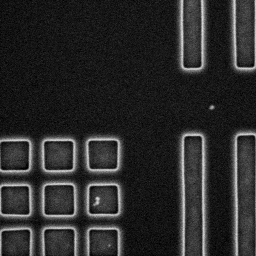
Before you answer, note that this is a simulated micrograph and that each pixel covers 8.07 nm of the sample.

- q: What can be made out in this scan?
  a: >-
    groups of lines, slits or small figures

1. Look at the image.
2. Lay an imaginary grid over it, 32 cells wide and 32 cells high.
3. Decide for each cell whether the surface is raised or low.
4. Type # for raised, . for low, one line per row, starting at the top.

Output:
#######################..####...
#######################..####...
#######################..####...
#######################..####...
#######################..####...
#######################..####...
#######################..####...
#######################..####...
#######################..#####.#
################################
################################
################################
################################
################################
################################
################################
################################
#..###...###..#########..#####..
....#....##....########..####...
....#....##....########..####...
....#....##....########..####...
#######################..####...
#######################..####...
....##...##....########..####...
....#....##....########..#####..
....#....##....########..#####..
....##...##....########..#####..
#######################..#####..
#######################..#####..
....#....##....########..#####..
....#....##....########..#####..
....#....##....########..#####..